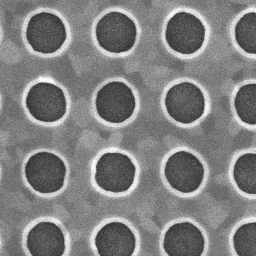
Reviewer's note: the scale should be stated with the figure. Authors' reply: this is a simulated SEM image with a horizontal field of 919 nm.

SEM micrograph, a regular array of holes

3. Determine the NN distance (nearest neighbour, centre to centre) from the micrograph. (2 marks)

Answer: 248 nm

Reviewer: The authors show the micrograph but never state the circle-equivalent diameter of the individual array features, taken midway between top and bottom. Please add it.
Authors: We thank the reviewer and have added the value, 157 nanometres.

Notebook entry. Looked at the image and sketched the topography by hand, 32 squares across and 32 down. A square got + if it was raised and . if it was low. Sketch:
++++++++++++++++++++++++++++++++
+++++..++++++..+++++++..+++++++.
+++.....++++.....++++....+++++..
+++.....++++.....++++.....+++...
+++......+++.....++++.....+++...
+++.....++++.....++++....++++...
++++...++++++...++++++...+++++..
++++++++++++++++++++++++++++++++
++++++++++++++++++++++++++++++++
++++++++++++++++++++++++++++++++
++++...++++++...++++++..++++++..
+++.....++++.....++++.....+++...
+++.....++++.....+++......+++...
+++.....++++.....++++.....+++...
++++....++++.....++++....+++++..
++++++++++++++.+++++++..+++++++.
++++++++++++++++++++++++++++++++
++++++++++++++++++++++++++++++++
++++++++++++++++++++++++++++++++
++++...+++++....+++++....+++++..
+++.....++++.....+++.....++++...
+++.....++++.....+++......+++...
+++.....++++.....++++.....+++...
++++....++++....+++++....+++++..
+++++++++++++++++++++++++++++++.
++++++++++++++++++++++++++++++++
++++++++++++++++++++++++++++++++
+++++.++++++++.+++++++++++++++++
++++....++++....+++++....+++++..
+++.....++++.....+++......+++...
+++.....++++.....+++......+++...
+++.....++++.....+++......+++...